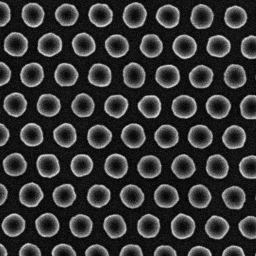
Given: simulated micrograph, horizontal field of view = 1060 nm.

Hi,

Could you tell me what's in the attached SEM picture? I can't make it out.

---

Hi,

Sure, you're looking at a regular array of raised bodies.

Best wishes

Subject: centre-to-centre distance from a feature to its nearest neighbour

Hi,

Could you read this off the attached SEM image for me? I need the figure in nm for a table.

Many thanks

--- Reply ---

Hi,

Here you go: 139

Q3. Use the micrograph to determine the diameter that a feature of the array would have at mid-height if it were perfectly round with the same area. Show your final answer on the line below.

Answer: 0.0938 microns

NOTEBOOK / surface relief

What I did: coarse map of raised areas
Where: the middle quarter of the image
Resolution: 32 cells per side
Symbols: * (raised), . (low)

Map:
**.....***......***.......*.....
***....****....*****...*****....
***...******...*****...******...
***...******...*****...******...
***....*****...*****...******...
................***......**.....
................................
................................
...****....****.....***.....****
..*****...******...*****...*****
..******..******...*****...*****
..*****...*****....*****...*****
...****....****.....****....****
................................
................................
**......**......***.....***.....
***...*****....*****...*****....
***...******...*****...*****...*
***...******...*****...*****...*
***...*****....*****...*****....
**.....***......***.....***.....
................................
................................
...***.....****.....***.....***.
..*****....*****...*****...*****
..*****...******..******...*****
..*****...******...*****...*****
...***.....****....*****....****
.............................**.
................................
**......*.......**......***.....
**.....****....****....*****....